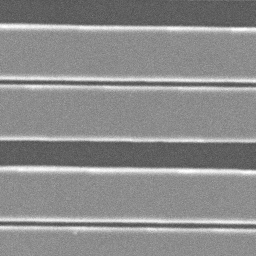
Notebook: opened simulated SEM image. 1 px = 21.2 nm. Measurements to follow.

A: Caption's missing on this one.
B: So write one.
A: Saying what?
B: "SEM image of lines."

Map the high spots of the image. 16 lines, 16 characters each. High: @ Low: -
----------------
----------------
@@@@@@@@@@@@@@@@
@@@@@@@@@@@@@@@@
@@@@@@@@@@@@@@@@
@@@@@@@@@@@@@@@@
@@@@@@@@@@@@@@@@
@@@@@@@@@@@@@@@@
@@@@@@@@@@@@@@@@
----------------
----------------
@@@@@@@@@@@@@@@@
@@@@@@@@@@@@@@@@
@@@@@@@@@@@@@@@@
@@@@@@@@@@@@@@@@
@@@@@@@@@@@@@@@@